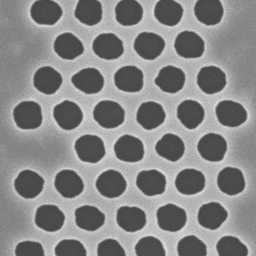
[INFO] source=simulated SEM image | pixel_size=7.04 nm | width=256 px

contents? a regular array of holes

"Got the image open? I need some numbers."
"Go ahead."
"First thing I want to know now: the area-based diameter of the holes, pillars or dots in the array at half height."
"29.3 pixels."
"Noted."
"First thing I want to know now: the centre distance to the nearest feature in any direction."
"275 nanometres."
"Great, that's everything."